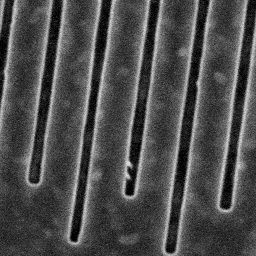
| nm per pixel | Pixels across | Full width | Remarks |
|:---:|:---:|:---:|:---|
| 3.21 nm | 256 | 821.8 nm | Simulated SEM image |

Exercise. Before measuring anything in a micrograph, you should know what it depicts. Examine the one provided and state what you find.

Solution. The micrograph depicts parallel lines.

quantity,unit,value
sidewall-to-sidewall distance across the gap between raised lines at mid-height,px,11.8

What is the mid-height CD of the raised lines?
119 nm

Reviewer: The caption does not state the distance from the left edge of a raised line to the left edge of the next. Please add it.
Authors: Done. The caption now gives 0.155 micrometres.